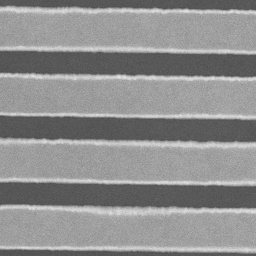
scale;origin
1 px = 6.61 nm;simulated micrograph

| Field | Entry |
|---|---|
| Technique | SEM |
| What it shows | lines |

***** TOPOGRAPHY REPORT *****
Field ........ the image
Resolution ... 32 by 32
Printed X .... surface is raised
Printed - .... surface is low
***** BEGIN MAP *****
--------------------------------
XXXXXXXXXXXXXXXXXXXXXXXXXXXXXXXX
XXXXXXXXXXXXXXXXXXXXXXXXXXXXXXXX
XXXXXXXXXXXXXXXXXXXXXXXXXXXXXXXX
XXXXXXXXXXXXXXXXXXXXXXXXXXXXXXXX
XXXXXXXXXXXXXXXXXXXXXXXXXXXXXXXX
------------------XXXXXXXXXXXXXX
--------------------------------
--------------------------------
XXXXXXXXXXXXXXXX-X--------------
XXXXXXXXXXXXXXXXXXXXXXXXXXXXXXXX
XXXXXXXXXXXXXXXXXXXXXXXXXXXXXXXX
XXXXXXXXXXXXXXXXXXXXXXXXXXXXXXXX
XXXXXXXXXXXXXXXXXXXXXXXXXXXXXXXX
----------XXXXXXXXXXXXXXXXXXXXXX
--------------------------------
--------------------------------
XXXXXXXXX-----------------------
XXXXXXXXXXXXXXXXXXXXXXXXXXXXXXXX
XXXXXXXXXXXXXXXXXXXXXXXXXXXXXXXX
XXXXXXXXXXXXXXXXXXXXXXXXXXXXXXXX
XXXXXXXXXXXXXXXXXXXXXXXXXXXXXXXX
XXXXXXXXXXXXXXXXXXXXXXXXXXXXXXXX
--------------------------------
--------------------------------
--------------------------------
XXXXXXXXXXXXXXXXXXXXXXXXXXXXXXXX
XXXXXXXXXXXXXXXXXXXXXXXXXXXXXXXX
XXXXXXXXXXXXXXXXXXXXXXXXXXXXXXXX
XXXXXXXXXXXXXXXXXXXXXXXXXXXXXXXX
XXXXXXXXXXXXXXXXXXXXXXXXXXXXXXXX
----------------------X--XXXXXXX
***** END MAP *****